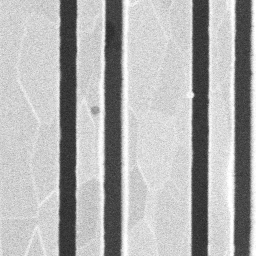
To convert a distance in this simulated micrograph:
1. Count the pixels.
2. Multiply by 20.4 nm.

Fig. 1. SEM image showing lines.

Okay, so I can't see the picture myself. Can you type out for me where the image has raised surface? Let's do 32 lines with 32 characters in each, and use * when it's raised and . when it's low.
*******...***...********..***...
*******...***...********..***...
*******...***...********..***...
*******...***..*********..***...
*******...***..*********..***...
*******...***..*********..***...
*******...***..*********..***...
*******...***..*********..***...
*******...***..*********..***...
*******...***..*********..***...
*******...***..*********..***...
*******...***..*********..***...
*******...***..*********..***...
*******...***..*********..***...
*******...***..*********..***...
*******...***..*********..***...
*******...***..*********..***...
*******...***..*********..***...
*******...***..*********..***...
*******...***..*********..***...
*******...***..*********..***...
*******...***..*********..***...
*******...***..*********..***...
*******...***..*********..***...
*******..****..*********..***...
*******...***..*********..***...
*******...***..*********..***...
*******...***..*********..***...
*******..****..*********..***...
*******...***..*********..***...
*******..****..*********..***...
*******..****..*********..***...